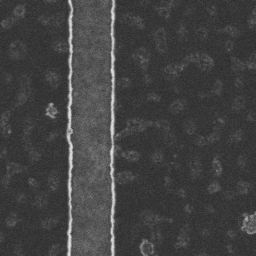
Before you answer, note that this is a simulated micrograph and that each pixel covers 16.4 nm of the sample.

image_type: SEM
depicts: one or a few lines or trenches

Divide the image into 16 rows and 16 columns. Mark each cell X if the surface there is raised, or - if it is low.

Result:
XXXX---XXXXXXXXX
XXXX---XXXXXXXXX
XXXX---XXXXXXXXX
XXXX---XXXXXXXXX
XXXX---XXXXXXXXX
XXXX---XXXXXXXXX
XXXX---XXXXXXXXX
XXXX---XXXXXXXXX
XXXX---XXXXXXXXX
XXXX---XXXXXXXXX
XXXX---XXXXXXXXX
XXXX---XXXXXXXXX
XXXX---XXXXXXXXX
XXXX---XXXXXXXXX
XXXX---XXXXXXXXX
XXXX---XXXXXXXXX